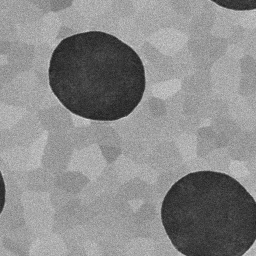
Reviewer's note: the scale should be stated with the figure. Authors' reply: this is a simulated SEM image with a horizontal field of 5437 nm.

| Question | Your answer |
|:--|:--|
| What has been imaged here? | holes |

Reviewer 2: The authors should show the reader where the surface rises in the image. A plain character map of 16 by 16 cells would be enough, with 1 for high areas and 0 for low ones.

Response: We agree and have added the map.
1111111111111100
1111111111111111
1111000011111111
1110000001111111
1110000001111111
1110000001111111
1111000001111111
1111110111111111
1111111111111111
1111111111111111
1111111111111111
1111111111100001
1111111111000000
1111111111000000
1111111111000000
1111111111100000